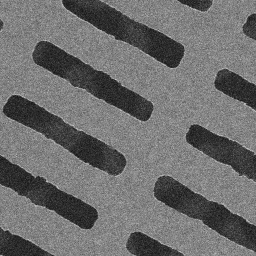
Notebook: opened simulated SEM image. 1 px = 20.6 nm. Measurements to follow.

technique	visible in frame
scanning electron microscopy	holes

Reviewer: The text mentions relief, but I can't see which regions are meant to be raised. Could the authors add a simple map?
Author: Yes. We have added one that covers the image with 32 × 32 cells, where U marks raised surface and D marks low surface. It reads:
UUUUUUUUDDDDDUUUUUUUUUUDDDDUUUUU
UUUUUUUUUDDDDDDUUUUUUUUUUUUUUUUU
UUUUUUUUUUDDDDDDDUUUUUUUUUUUUUUD
UUUUUUUUUUUUDDDDDDDUUUUUUUUUUUDD
UUUUUUUUUUUUUUDDDDDDDUUUUUUUUUUD
UUUUUDDUUUUUUUUUDDDDDDDUUUUUUUUU
UUUUDDDDUUUUUUUUUUDDDDDUUUUUUUUU
UUUUDDDDDDUUUUUUUUUDDDDUUUUUUUUU
UUUUUDDDDDDDUUUUUUUUUDUUUUUUUUUU
UUUUUUUDDDDDDDUUUUUUUUUUUUUDDDUU
UUUUUUUUUDDDDDDUUUUUUUUUUUUDDDDD
UUUUUUUUUUUDDDDDDUUUUUUUUUUUDDDD
UDDDUUUUUUUUUDDDDDDUUUUUUUUUUUDD
DDDDDUUUUUUUUUUDDDDUUUUUUUUUUUUD
UDDDDDDUUUUUUUUUDDDUUUUUUUUUUUUU
UUUDDDDDDUUUUUUUUUUUUUUUUUUUUUUU
UUUUUDDDDDDUUUUUUUUUUUUDDDDUUUUU
UUUUUUDDDDDDDUUUUUUUUUUDDDDDDUUU
UUUUUUUUDDDDDDUUUUUUUUUUDDDDDDDU
UUUUUUUUUDDDDDDDUUUUUUUUUUDDDDDD
DDUUUUUUUUUDDDDDUUUUUUUUUUUUDDDD
DDDDUUUUUUUUUDDUUUUUUUUUUUUUUDDD
DDDDDDUUUUUUUUUUUUUUDDUUUUUUUUUD
UDDDDDDUUUUUUUUUUUUDDDDDUUUUUUUU
UUUDDDDDDUUUUUUUUUUDDDDDDUUUUUUU
UUUUDDDDDDDUUUUUUUUUUDDDDDDDUUUU
UUUUUUUDDDDDUUUUUUUUUUDDDDDDDUUU
UUUUUUUUDDDDUUUUUUUUUUUUUDDDDDDU
UUUUUUUUUUDUUUUUUUUUUUUUUUDDDDDD
DDDUUUUUUUUUUUUUDDDUUUUUUUUUDDDD
DDDDUUUUUUUUUUUUDDDDUUUUUUUUUUDD
DDDDDDUUUUUUUUUUDDDDDDDUUUUUUUUU